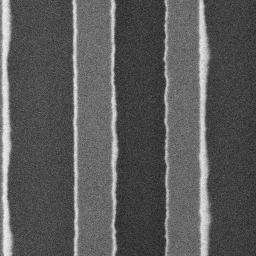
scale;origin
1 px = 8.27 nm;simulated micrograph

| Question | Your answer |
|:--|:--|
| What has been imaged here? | lines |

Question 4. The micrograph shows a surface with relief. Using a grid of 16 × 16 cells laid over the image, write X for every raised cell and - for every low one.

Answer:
-----XX---XXX---
-----XX---XXX---
-----XX---XXX---
-----XX---XXX---
-----XX---XXX---
-----XX---XXX---
-----XX---XXX---
-----XX---XXX---
-----XX---XXX---
-----XX---XXX---
-----XX---XXX---
-----XX---XXX---
-----XX---XXX---
-----XX---XXX---
-----XX---XXX---
-----XX---XXX---